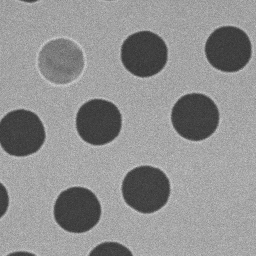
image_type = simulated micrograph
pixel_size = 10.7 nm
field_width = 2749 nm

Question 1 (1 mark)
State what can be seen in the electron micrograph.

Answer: holes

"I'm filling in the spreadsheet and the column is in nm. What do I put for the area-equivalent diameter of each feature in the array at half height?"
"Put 510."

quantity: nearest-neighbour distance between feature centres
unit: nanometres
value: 810